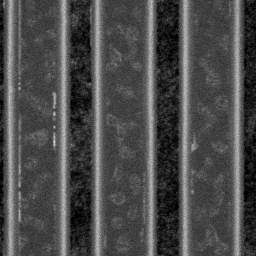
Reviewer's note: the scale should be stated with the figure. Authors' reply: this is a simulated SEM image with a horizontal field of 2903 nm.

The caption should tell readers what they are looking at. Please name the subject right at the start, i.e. one or a few lines or trenches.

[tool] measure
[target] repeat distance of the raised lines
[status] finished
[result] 990 nanometres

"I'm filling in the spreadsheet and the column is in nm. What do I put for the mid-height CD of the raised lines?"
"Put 600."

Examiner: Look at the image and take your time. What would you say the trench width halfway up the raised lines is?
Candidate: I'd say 393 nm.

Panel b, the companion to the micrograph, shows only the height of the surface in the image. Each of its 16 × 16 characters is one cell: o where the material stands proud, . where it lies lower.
.ooo..ooo...ooo.
.ooo..ooo...ooo.
.ooo..ooo...ooo.
.ooo..ooo...ooo.
.ooo..ooo...ooo.
.ooo..ooo...ooo.
.ooo..ooo...ooo.
.ooo..ooo...ooo.
.ooo..ooo...ooo.
.ooo..ooo...ooo.
.ooo..ooo...ooo.
.ooo..ooo...ooo.
.ooo..ooo...ooo.
.ooo..ooo...ooo.
.ooo..ooo...ooo.
.ooo..ooo...ooo.